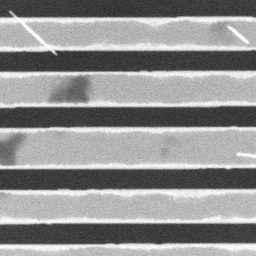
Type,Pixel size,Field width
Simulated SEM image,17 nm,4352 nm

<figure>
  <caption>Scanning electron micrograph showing lines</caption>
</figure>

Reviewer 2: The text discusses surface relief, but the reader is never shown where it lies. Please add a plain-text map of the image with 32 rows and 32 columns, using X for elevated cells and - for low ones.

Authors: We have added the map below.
--------------------------------
--------------------------------
XXXXXXXXXXXXXXXXXXXXXXXXXXXXXXXX
XXXXXXXXXXXXXXXXXXXXXXXXXXXXXXXX
XXXXXXXXXXXXXXXXXXXXXXXXXXXXXXXX
XXXXXXXXXXXXXXXXXXXXXXXXXXXXXXXX
------X-------------------------
--------------------------------
--------------------------------
XXXXXXXXXXXXXXXXXXXXXXXXXXXXXXXX
XXXXXXXXXXXXXXXXXXXXXXXXXXXXXXXX
XXXXXXXXXXXXXXXXXXXXXXXXXXXXXXXX
XXXXXXXXXXXXXXXXXXXXXXXXXXXXXXXX
--------------------------------
--------------------------------
--------------------------------
XXXXXXXXXXXXXXXXXXXXXXXXXXXXXXXX
XXXXXXXXXXXXXXXXXXXXXXXXXXXXXXXX
XXXXXXXXXXXXXXXXXXXXXXXXXXXXXXXX
XXXXXXXXXXXXXXXXXXXXXXXXXXXXXXXX
XXXXXXXXXXXXXXXXXXXXXXXXXXXXXXXX
--------------------------------
--------------------------------
--------------------------------
XXXXXXXXXXXXXXXXXXXXXXXXXXXXXXXX
XXXXXXXXXXXXXXXXXXXXXXXXXXXXXXXX
XXXXXXXXXXXXXXXXXXXXXXXXXXXXXXXX
XXXXXXXXXXXXXXXXXXXXXXXXXXXXXXXX
--------------------------------
--------------------------------
--------------------------------
XXXXXXXXXXXXXXXXXXXXXXXXXXXXXXXX